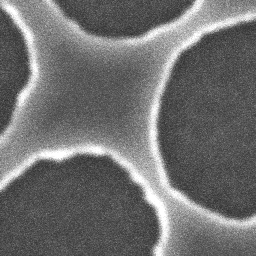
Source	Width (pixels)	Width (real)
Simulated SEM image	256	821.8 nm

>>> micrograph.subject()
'holes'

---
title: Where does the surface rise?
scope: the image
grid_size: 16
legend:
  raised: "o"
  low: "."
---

oooo........oooo
.oooo......oooo.
..oooooooooo....
..ooooooooo.....
..ooooooooo.....
..oooooooo......
.ooooooooo......
.ooooooooo......
oooooooooo......
oooooooooo......
oo......oo......
.........oo.....
.........ooo....
..........oooo..
..........oooooo
..........oooooo